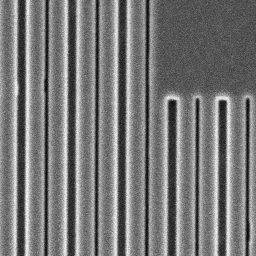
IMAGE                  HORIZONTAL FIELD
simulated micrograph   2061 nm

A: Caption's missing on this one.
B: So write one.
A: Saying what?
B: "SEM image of parallel lines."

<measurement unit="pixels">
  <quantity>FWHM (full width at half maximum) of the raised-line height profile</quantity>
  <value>18.5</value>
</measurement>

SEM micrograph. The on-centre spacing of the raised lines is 202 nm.